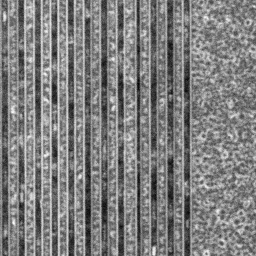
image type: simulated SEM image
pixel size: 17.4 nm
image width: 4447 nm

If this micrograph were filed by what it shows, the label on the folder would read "parallel lines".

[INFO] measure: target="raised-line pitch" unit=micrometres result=0.287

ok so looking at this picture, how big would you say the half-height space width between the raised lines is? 128 nanometres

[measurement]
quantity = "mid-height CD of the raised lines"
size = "158 nm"